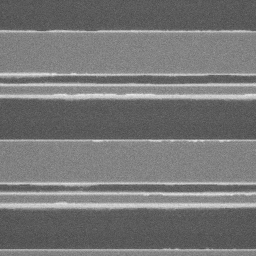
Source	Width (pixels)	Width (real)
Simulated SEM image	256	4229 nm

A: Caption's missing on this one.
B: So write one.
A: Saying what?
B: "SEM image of lines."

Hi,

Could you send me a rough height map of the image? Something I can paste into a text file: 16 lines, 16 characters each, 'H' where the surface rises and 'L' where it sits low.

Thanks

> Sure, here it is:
LLLLLLLLLLLLLLLL
LLLLLLLLLLLLLLLL
HHHHHHHHHHHHHHHH
HHHHHHHHHHHHHHHH
HHHHHHHHHHHHHHHH
HHHHHHHHHHHHHHHH
LLLLLLLLLLLLLLLL
LLLLLLLLLLLLLLLL
LLLLLLLLLLLLLLLL
HHHHHHHHHHHHHHHH
HHHHHHHHHHHHHHHH
HHHHHHHHHHHHHHHH
HHHHHHHHHHHHHHHH
LLLLLLLLLLLLLLLL
LLLLLLLLLLLLLLLL
LLLLLLLLLLLLLLLL